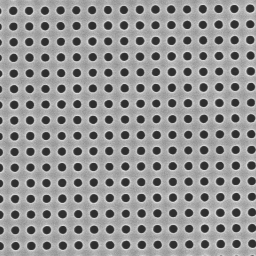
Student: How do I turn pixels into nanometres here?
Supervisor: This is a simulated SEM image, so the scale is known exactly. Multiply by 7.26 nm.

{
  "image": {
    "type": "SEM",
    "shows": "a regular array of holes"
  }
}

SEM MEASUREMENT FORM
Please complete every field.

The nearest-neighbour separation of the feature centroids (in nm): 112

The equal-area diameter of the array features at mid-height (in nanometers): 61.3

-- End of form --